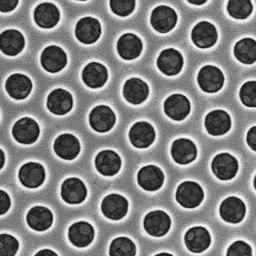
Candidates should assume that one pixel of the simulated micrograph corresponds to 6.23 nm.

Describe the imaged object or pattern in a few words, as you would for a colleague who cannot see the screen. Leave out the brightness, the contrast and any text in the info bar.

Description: a regular array of holes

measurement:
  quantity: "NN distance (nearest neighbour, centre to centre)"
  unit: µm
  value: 0.272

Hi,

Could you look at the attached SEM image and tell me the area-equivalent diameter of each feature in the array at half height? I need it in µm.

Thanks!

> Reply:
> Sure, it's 0.173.